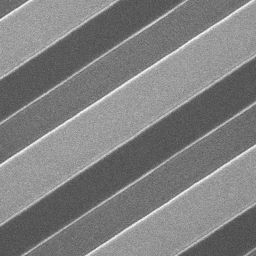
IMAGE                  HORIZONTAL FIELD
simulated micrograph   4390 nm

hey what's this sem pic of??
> lines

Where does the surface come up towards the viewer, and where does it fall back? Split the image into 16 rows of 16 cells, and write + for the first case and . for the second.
.++++++++++....+
+++++++++.....++
++++++++....++++
++++++....++++++
+++++....+++++++
+++....+++++++++
++....++++++++++
....++++++++++..
...++++++++++...
.++++++++++....+
++++++++++....++
++++++++....++++
+++++++....+++++
+++++....+++++++
++++....++++++++
++....++++++++++